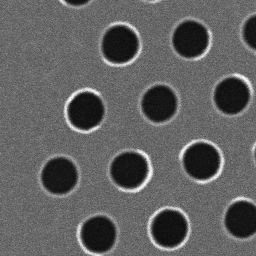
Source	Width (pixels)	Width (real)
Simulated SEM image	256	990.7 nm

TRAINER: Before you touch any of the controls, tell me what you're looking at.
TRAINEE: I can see a regular array of holes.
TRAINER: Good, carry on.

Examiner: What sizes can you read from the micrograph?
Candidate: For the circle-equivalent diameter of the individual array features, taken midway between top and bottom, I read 142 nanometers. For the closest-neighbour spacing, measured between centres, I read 272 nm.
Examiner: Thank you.